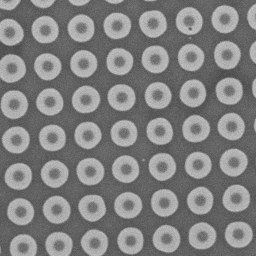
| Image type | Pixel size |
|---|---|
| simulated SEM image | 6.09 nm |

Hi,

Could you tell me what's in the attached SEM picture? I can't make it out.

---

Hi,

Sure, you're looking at an array of small figures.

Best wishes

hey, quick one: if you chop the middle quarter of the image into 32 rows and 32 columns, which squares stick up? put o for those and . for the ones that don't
..oooooo...oooooo...oooooo...ooo
..oooooo...ooooo.....oooo......o
...oooo......oo.................
................................
...............................o
.............ooo.....ooooo....oo
...ooooo...oooooo....ooooo...ooo
..ooooooo..ooooooo..ooooooo..ooo
..ooooooo..ooooooo..ooooooo..ooo
..ooooooo..ooooooo...ooooo....oo
..oooooo....ooooo....ooooo.....o
...ooooo......oo................
................................
...............................o
.............oooo....ooooo....oo
....oooo....oooooo...oooooo...oo
...oooooo...oooooo...oooooo...oo
...oooooo...oooooo...oooooo...oo
...oooooo...oooooo...oooooo...oo
...oooooo....ooooo....oooo......
....oooo.......o................
................................
........................oo......
..............ooo.....ooooo....o
....ooooo....ooooo...ooooooo..oo
...ooooooo..ooooooo..ooooooo..oo
o..ooooooo..ooooooo..ooooooo..oo
o..ooooooo..ooooooo...ooooo....o
o...oooooo...ooooo.....ooo......
....ooooo......oo...............
................................
........................oo......